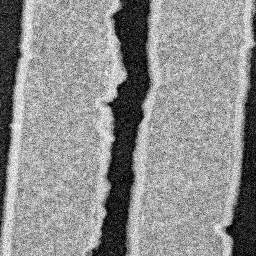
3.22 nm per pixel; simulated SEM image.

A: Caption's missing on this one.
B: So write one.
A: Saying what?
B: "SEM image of one or a few lines or trenches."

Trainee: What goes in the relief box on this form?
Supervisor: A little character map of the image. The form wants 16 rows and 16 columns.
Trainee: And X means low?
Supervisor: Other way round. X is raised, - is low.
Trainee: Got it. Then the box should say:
--XXXXX---XXXXXX
--XXXXX---XXXXX-
--XXXXX---XXXXX-
--XXXXX---XXXXX-
-XXXXXX---XXXXX-
-XXXXXX---XXXXX-
-XXXXXX--XXXXXX-
-XXXXXX--XXXXXX-
-XXXXXX--XXXXXX-
-XXXXXX--XXXXXX-
-XXXXX---XXXXXX-
-XXXXX---XXXXXX-
-XXXXX---XXXXX--
-XXXXX--XXXXXX--
XXXXXX--XXXXXX--
XXXXXX--XXXXXX--